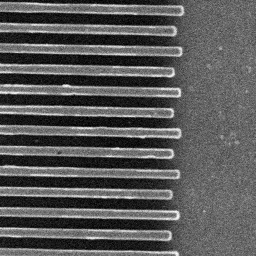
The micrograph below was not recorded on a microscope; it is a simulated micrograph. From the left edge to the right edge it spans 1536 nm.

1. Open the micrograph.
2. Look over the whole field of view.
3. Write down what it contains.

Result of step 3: parallel lines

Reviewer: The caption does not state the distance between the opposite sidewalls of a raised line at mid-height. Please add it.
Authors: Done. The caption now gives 9.25 pixels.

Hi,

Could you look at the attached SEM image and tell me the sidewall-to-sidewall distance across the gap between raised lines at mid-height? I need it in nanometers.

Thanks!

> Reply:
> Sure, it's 66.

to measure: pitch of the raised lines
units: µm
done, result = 0.123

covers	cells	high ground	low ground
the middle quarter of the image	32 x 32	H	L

HHHHHHLLLLLLLLLLLLLLLLLLLLLLLLLL
HHHHHHHHHHHHHHHHHHHHHHHHHHHLLLLL
LLHHHHHHHHHHHHHHHHHHHHHHHHHHLLLL
LLLLLLLLLLLLLLLLLLLLLLLLLLLLLLLL
LLLLLLLLLLLLLLLLLLLLLLLLLLLLLLLL
HHHLLLLLLLLLLLLLLLLLLLLLLLLLLLLL
HHHHHHHHHHHHHHHHHHHHHHHHHHHHHLLL
HHHHHHHHHHHHHHHHHHHHHHHHHHHHHLLL
LLLLLLLLLLLLLLLLLLLLLLLLLLLLLLLL
LLLLLLLLLLLLLLLLLLLLLLLLLLLLLLLL
LLLLLLLLLLLLLLLLLLLLLLLLLLLLLLLL
HHHHHHHHHHHHHHHHHHHHHHHHHHHLLLLL
HHHHHHHHHHHHHHHHHHHHHHHHHHHLLLLL
LLLLLLLLLLLLLLLLLLLLLLLLLLLLLLLL
LLLLLLLLLLLLLLLLLLLLLLLLLLLLLLLL
LLLLLLLLLLLLLLLLLLLLLLLLLLLLLLLL
HHHHHHHHHHHHHHHHHHHHHHHHHHHHHLLL
HHHHHHHHHHHHHHHHHHHHHHHHHHHHHLLL
LLLLLLLLLLLLLLLLLLLHHLLLLLLLLLLL
LLLLLLLLLLLLLLLLLLLLLLLLLLLLLLLL
LLLLLLLLLLLLLLLLLLLLLLLLLLLLLLLL
HHHHHHHHHHHHHHHHHHHHHHHHHHHLLLLL
HHHHHHHHHHHHHHHHHHHHHHHHHHHLLLLL
LLLLLLLLLLLLLLLLLLLLLLLLLLHLLLLL
LLLLLLLLLLLLLLLLLLLLLLLLLLLLLLLL
LLLLLLLLLLLLLLLLLLLLLLLLLLLLLLLL
HHHHHHHHHHHHHHHHHHHHLLLLLLLLLLLL
HHHHHHHHHHHHHHHHHHHHHHHHHHHHHLLL
LLLLLLLLLLLLLLLLLLLLLLLHHHHHLLLL
LLLLLLLLLLLLLLLLLLLLLLLLLLLLLLLL
LLLLLLLLLLLLLLLLLLLLLLLLLLLLLLLL
HHHHHHHHHHHHHHHHHLHHHHHHLLLLLLLL